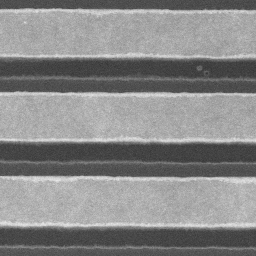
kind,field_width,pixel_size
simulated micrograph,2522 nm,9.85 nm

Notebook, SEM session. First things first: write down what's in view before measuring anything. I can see lines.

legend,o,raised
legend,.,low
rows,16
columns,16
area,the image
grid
................
oooooooooooooooo
oooooooooooooooo
oooooooooooooooo
................
................
oooooooooooooooo
oooooooooooooooo
oooooooooooooooo
................
................
oooooooooooooooo
oooooooooooooooo
oooooooooooooooo
................
................